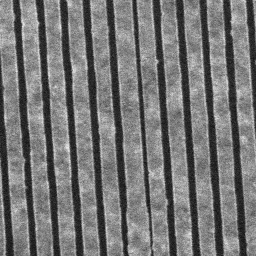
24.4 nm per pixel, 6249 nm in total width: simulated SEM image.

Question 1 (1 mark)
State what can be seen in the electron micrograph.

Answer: parallel lines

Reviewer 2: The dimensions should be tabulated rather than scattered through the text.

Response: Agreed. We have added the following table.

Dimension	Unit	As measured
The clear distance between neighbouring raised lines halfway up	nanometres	210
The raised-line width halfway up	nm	359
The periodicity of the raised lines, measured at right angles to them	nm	568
